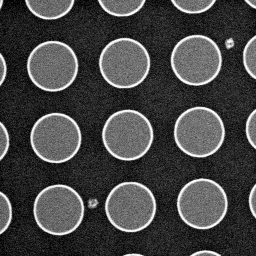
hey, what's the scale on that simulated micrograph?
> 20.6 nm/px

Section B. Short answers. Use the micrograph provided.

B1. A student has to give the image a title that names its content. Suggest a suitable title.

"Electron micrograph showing an array of small figures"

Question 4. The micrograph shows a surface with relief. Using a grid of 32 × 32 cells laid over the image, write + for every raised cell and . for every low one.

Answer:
...++++++....+++++....+++++....+
....++++.....++++......++.......
................................
................................
........................+.......
.....+++......++++....+++++....+
....+++++....+++++....+++++...++
....++++++..+++++++..+++++++...+
+...++++++...++++++...++++++...+
+...+++++....+++++....+++++....+
....+++++.....+++.......+.......
................................
................................
........................++......
......++......++++.....++++....+
....++++++...++++++...++++++...+
+...++++++...++++++...++++++...+
+...++++++...++++++...++++++...+
+...++++++...++++++....++++.....
.....++++.....++++......++......
................................
................................
.........................+......
......+++.....++++.....+++++....
+....+++++....+++++...++++++...+
+...++++++...++++++...++++++...+
+...++++++...++++++...++++++....
+....+++++....+++++....+++++....
+....++++......+++.......+......
................................
................................
.........................++.....